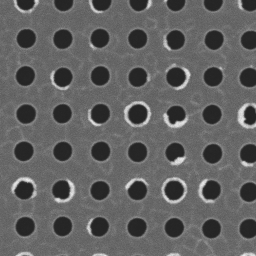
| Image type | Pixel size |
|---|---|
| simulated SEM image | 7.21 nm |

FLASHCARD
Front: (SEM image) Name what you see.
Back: a regular array of holes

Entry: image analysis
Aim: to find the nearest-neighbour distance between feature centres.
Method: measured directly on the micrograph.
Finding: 264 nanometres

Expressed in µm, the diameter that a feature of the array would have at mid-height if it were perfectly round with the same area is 0.138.